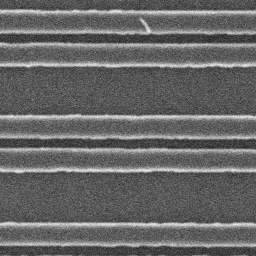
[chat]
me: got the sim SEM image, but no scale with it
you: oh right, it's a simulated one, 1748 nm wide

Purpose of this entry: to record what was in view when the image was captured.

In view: lines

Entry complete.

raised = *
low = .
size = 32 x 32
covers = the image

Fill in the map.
................................
********************************
********************************
********************************
................................
*..*****........................
********************************
********************************
................................
................................
................................
................................
................................
................................
.........*......................
********************************
********************************
................................
................................
********************************
********************************
..*.............................
................................
................................
................................
................................
................................
................................
********************************
********************************
********************************
................................